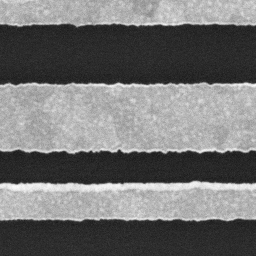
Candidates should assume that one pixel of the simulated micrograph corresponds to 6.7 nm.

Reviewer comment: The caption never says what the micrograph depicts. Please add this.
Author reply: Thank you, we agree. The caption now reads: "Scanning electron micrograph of lines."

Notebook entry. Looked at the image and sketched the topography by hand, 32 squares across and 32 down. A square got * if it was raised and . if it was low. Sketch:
********************************
********************************
********************************
................................
................................
................................
................................
................................
................................
................................
....*....................*....*.
********************************
********************************
********************************
********************************
********************************
********************************
********************************
********************************
................................
................................
................................
................................
********************************
********************************
********************************
********************************
.........*.............**...*...
................................
................................
................................
................................